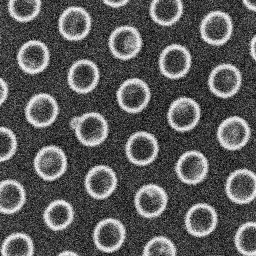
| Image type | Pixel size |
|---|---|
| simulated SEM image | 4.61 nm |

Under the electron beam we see a regular array of raised bodies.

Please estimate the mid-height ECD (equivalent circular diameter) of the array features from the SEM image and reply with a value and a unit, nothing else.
140 nanometers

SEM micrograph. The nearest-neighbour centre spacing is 245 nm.